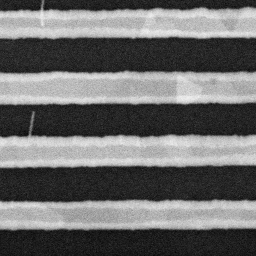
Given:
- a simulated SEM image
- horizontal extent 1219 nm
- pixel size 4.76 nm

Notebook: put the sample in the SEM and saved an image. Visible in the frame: lines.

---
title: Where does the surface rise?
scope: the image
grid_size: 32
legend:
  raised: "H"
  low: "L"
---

LLLLLLLLLLLLLLLLLLLLLLLLLLLLLLLL
LLHHLHHLLLHLLLHHHHHHHHHHHHHHHHHH
HHHHHHHHHHHHHHHHHHHHHHHHHHHHHHHH
HHHHHHHHHHHHHHHHHHHHHHHHHHHHHHHH
HHHHHHHHHHLLLLLHHHHHHLHHHHHHHHHH
LLLLLLLLLLLLLLLLLLLLLLLLLLLLLLLL
LLLLLLLLLLLLLLLLLLLLLLLLLLLLLLLL
LLLLLLLLLLLLLLLLLLLLLLLLLLLLLLLL
LLLLLLLLLLLLLLLLLLLLLLLLLLLLLLLL
HHHHHHHHHHHHHHHHHHHHHHHHHHHHHHHH
HHHHHHHHHHHHHHHHHHHHHHHHHHHHHHHH
HHHHHHHHHHHHHHHHHHHHHHHHHHHHHHHH
HHHHHHHHHHHHHHHHHHHHHHHHHHHHHHHH
LLLLLLLLLLLLLLLLLLLLLLLLLLLLLLLL
LLLLLLLLLLLLLLLLLLLLLLLLLLLLLLLL
LLLLLLLLLLLLLLLLLLLLLLLLLLLLLLLL
LLLLLLLLLLLLLLLLLLLLLLLLLLLLLLLL
HHHHHHHHHHHHHHHHHHHHHHHHHHHHHHHH
HHHHHHHHHHHHHHHHHHHHHHHHHHHHHHHH
HHHHHHHHHHHHHHHHHHHHHHHHHHHHHHHH
HHHHHHHHHHHHHHHHHLHHHHHHHHLLLLLL
LLLLLLLLLLLLLLLLLLLLLLLLLLLLLLLL
LLLLLLLLLLLLLLLLLLLLLLLLLLLLLLLL
LLLLLLLLLLLLLLLLLLLLLLLLLLLLLLLL
LLLLLLLLLLLLLLLLLLLLLLLLLLLLLLLL
HHHHHHHHHHHHHHHHHHHHHHHHHHHHHHHH
HHHHHHHHHHHHHHHHHHHHHHHHHHHHHHHH
HHHHHHHHHHHHHHHHHHHHHHHHHHHHHHHH
HHHHLHHHHHHHHHHHHHHLLLHLHLLLLLLL
LLLLLLLLLLLLLLLLLLLLLLLLLLLLLLLL
LLLLLLLLLLLLLLLLLLLLLLLLLLLLLLLL
LLLLLLLLLLLLLLLLLLLLLLLLLLLLLLLL